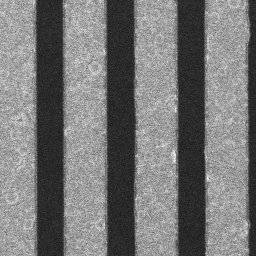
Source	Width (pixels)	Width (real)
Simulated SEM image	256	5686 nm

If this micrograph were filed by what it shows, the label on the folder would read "one or a few lines or trenches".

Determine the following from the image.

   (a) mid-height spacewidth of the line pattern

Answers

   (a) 41.4 pixels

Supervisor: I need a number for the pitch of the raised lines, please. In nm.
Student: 1560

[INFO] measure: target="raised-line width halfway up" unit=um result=0.644